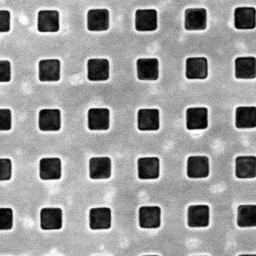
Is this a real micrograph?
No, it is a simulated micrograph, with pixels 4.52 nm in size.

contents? a regular array of holes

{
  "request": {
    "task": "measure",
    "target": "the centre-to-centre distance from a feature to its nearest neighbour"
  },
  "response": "218 nm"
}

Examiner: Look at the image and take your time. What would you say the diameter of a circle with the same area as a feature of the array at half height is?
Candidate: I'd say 113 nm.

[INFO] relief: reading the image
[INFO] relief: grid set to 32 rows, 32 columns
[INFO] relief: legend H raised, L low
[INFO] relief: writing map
HHHHHHHHHHHHHHHHHHHHHHHHHHHHHHHH
LHHHHLLHHHHLLLHHHLLLHHHLLLHHHLLL
LHHHHLLLHHHLLLHHHLLLHHHLLLHHHLLL
LHHHHLLHHHHLLLHHHLLLHHHLLLHHHHLL
HHHHHHHHHHHHHHHHHHHHHHHHHHHHHHHH
HHHHHHHHHHHHHHHHHHHHHHHHHHHHHHHH
HHHHHHHHHHHHHHHHHHHHHHHHHHHHHHHH
HHHHHLLHHHHLLHHHHLLLHHHLLLHHHLLL
LHHHHLLLHHHLLLHHHLLLHHHLLLHHHLLL
LHHHHLLLHHHLLLHHHLLLHHHLLLHHHLLL
HHHHHHHHHHHHHHHHHHHHHHHHHHHHHHHH
HHHHHHHHHHHHHHHHHHHHHHHHHHHHHHHH
HHHHHHHHHHHHHHHHHHHHHHHHHHHHHHHH
LHHHHHHHHHHHLHHHHHLHHHHHLHHHHHLL
LLHHHLLLHHHLLLHHHLLLHHHLLLHHHLLL
LLHHHLLLHHHLLLHHHLLLHHHLLLHHHLLL
HHHHHHLHHHHHHHHHHHHHHHHHHHHHHHHH
HHHHHHHHHHHHHHHHHHHHHHHHHHHHHHHH
HHHHHHHHHHHHHHHHHHHHHHHHHHHHHHHH
HHHHHHHHHHHHHHHHHHHHHHHHLLHHHHLH
LHHHHLLLHHHLLLHHHLLLHHHLLLHHHLLL
LHHHHLLLHHHLLLHHHLLLHHHLLLHHHLLL
LHHHHLLHHHHHLHHHHHHHHHHHHHHHHHHH
HHHHHHHHHHHHHHHHHHHHHHHHHHHHHHHH
HHHHHHHHHHHHHHHHHHHHHHHHHHHHHHHH
HHHHHHHHHHHHHHHHHHHHHHHHHHHHHHLL
LLHHHLLLHHHLLLHHHLLLHHHLLLHHHHLL
LLHHHLLLHHHLLLHHHLLLHHHLLLHHHHLL
LHHHHLLLHHHLLLHHHHLLHHHHHHHHHHHH
HHHHHHHHHHHHHHHHHHHHHHHHHHHHHHHH
HHHHHHHHHHHHHHHHHHHHHHHHHHHHHHHH
HHHHHHHHHHHHHHHHHHHHHHHHHHHHHHHH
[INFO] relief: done